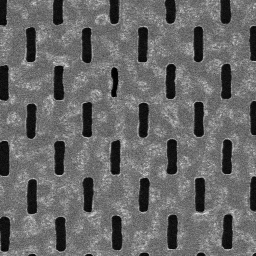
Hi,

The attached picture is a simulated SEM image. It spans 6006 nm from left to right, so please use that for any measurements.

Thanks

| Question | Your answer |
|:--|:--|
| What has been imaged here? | a regular array of holes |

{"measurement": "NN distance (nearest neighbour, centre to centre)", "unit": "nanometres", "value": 1090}